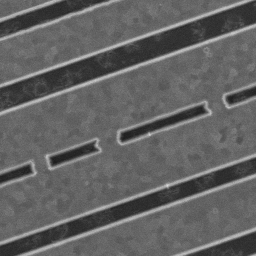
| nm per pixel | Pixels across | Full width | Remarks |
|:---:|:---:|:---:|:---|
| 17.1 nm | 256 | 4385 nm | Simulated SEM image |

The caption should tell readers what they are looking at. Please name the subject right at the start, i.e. one or a few lines or trenches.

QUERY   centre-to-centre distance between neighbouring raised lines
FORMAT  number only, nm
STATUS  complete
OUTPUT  1200